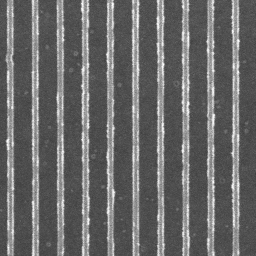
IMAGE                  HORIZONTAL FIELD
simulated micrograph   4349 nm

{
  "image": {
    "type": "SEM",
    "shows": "parallel lines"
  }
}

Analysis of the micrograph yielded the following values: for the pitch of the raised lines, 0.425 um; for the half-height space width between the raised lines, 329 nm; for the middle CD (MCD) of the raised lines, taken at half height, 95.6 nanometres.